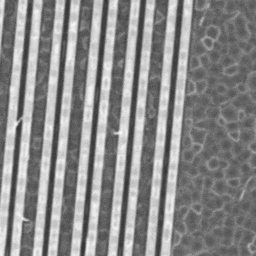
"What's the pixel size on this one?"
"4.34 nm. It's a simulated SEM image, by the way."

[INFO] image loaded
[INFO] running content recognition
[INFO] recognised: parallel lines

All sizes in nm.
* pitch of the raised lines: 79.6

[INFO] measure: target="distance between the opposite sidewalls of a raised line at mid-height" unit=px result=8.34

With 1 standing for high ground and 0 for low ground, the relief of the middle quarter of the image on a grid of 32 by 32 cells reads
11100011001100011001100001100110
11000011001100011001100001101110
11000011001100011001100001101110
11000011001100011001100001001100
11000011001100011001100011001100
11000011011000011001100011001100
11000111011000011001100011001100
11000111011000011001100011001100
11000110011000011001000011001100
11000110011000111011000011001100
11000110011000111011000011001100
11000110011000110011000011001000
10000110011000110011000011011000
10000110011000110011000011011000
10000110011000110011000010011000
10000110010000110011000110011000
10000110110000110011000110011000
10001110110000110011000110011000
10001100110000110011000110011000
10001100110000110010000110011000
10001100110000110110000110011000
10001100110000110110000110011000
10001100110000100110000110010000
00001100110001100110000110110000
00001100110001100110000110110000
00001100110001100110000100110000
00001100100001100110001100110000
00001101100001100110001100110000
00011101100001100110001100110000
00011001100001100110001100110000
00011001100001100100001100110000
00011001100001101100001100110000